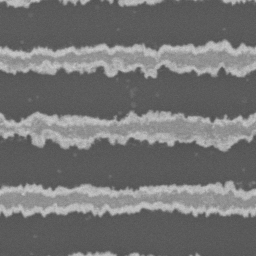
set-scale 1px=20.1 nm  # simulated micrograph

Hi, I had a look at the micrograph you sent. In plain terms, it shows one or a few lines or trenches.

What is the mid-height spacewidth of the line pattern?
1050 nm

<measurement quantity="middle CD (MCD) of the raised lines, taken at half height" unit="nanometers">355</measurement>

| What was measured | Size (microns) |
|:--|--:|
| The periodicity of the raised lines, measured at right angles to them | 1.42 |